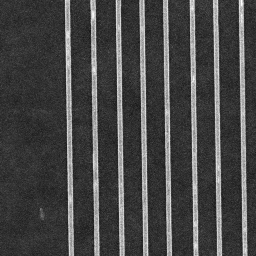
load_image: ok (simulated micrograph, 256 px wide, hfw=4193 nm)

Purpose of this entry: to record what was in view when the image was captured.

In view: parallel lines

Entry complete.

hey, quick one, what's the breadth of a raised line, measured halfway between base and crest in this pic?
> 73.7 nm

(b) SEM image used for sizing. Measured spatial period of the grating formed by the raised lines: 407 nanometres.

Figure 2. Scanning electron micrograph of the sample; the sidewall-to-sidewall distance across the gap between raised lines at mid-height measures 0.346 microns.